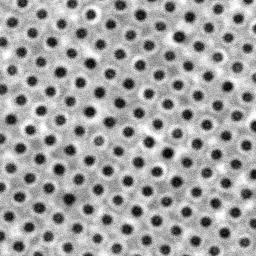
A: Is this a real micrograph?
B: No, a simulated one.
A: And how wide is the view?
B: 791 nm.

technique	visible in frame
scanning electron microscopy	a regular array of ring-shaped grooves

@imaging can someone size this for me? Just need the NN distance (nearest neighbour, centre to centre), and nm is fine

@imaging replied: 65.8